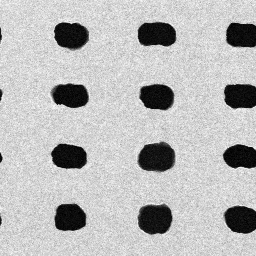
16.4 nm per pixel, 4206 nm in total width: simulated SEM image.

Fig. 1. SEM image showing a regular array of holes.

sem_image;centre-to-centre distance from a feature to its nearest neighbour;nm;1000